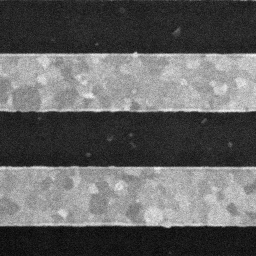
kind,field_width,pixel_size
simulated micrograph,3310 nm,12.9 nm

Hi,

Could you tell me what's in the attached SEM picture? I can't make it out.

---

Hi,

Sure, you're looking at lines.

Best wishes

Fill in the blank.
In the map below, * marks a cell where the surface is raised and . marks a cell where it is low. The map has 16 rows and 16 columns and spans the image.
................
................
................
****************
****************
****************
****************
................
................
................
****************
****************
****************
****************
................
................